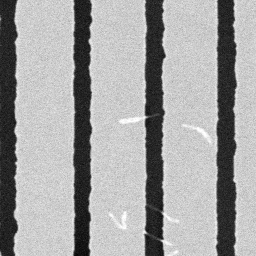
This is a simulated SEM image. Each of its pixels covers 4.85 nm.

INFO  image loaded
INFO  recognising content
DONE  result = lines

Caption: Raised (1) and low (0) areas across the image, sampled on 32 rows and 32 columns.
00111111100111111100111111100111
00111111100111111100111111100111
00111111100011111100111111100111
00111111100111111100011111100111
00111111100111111100111111100111
00111111100111111100111111100011
00111111100111111100011111100011
00111111100111111100111111100111
00111111100111111100111111100111
00111111100111111100111111100111
00111111100111111100111111100011
00111111100111111100111111100111
00111111100111111100111111100111
00111111100111111100111111100111
00111111100111111100011111100111
00111111100111111100111111100111
00111111100011111100111111100111
00111111100111111100111111100111
00111111100111111100111111100011
00111111100111111100111111100111
00111111100111111100111111100111
00111111100111111100111111100111
00111111100111111100111111100111
00111111100111111100111111100011
00111111100111111100111111100011
00111111100111111100111111100111
00111111100111111100111111100011
00111111100111111100111111100111
00111111100111111100111111100111
00111111100111111100111111100111
00111111100111111100111111100111
00111111100111111100111111100111